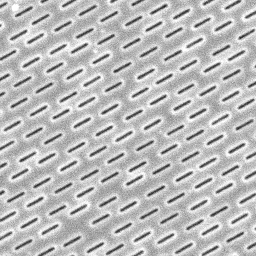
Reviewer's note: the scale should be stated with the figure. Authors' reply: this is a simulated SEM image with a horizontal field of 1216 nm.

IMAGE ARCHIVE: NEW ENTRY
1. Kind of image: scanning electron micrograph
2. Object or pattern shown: a regular array of holes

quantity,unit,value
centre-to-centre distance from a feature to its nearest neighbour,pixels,20.1